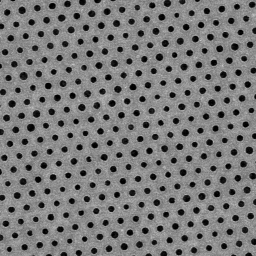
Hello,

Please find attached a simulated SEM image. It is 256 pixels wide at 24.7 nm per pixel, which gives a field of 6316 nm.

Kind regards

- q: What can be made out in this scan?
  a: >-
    a regular array of holes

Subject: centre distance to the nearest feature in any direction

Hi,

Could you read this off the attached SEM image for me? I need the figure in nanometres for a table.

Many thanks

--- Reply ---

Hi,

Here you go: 369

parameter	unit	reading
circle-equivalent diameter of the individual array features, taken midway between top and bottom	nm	167